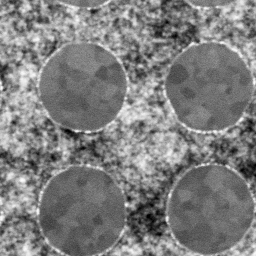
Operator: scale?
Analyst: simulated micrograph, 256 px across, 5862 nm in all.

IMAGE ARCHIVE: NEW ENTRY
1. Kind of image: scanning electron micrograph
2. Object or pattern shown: raised bodies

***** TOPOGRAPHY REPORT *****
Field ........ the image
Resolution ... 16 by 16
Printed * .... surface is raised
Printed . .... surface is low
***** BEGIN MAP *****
................
................
................
...****....****.
...*****...*****
..******..******
...*****...*****
...****....****.
................
................
....**......**..
...****....****.
..******...*****
..******..******
...*****...****.
...****.....**..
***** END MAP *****